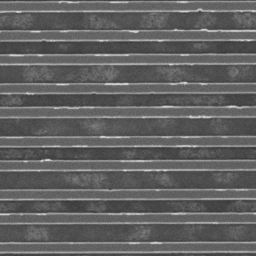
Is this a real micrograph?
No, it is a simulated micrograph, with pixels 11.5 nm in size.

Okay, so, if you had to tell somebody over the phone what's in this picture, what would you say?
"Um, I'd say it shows parallel lines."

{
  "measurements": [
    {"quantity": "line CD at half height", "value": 121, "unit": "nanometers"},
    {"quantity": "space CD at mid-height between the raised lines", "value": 212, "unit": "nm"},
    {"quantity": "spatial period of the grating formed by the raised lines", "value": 308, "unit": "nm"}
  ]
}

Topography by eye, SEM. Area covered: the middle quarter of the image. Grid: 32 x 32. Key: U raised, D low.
DDDDDDDDDDDDDDDDDDDDDDDDDDDDDDDD
DDDDDDDDDDDDDDDDDDDDDDDDDDDDDDDD
DDDDDDDDDDDDDDDDDDDDDDDDDDDDDDDD
DDDDDDDDDDDDDDDDDDDDDDDDDDDDDDDD
DDDDDDDDDDDDDDDDDDDDDDDDDDDDDDDD
UUUUUUUUUUUUUUUUUUUUUUUUUUUUUUUU
UUUUUUUUUUUUUUUUUUUUUUUUUUUUUUUU
DDDDDDDDDDDDDDDDDDDDDDDDDDDDDDDD
DDDDDDDDDDDDDDDDDDDDDDDDDDDDDDDD
DDDDDDDDDDDDDDDDDDDDDDDDDDDDDDDD
DDDDDDDDDDDDDDDDDDDDDDDDDDDDDDDD
UUUUUUUUUUUUUUUUUUUUUUUUUUUUUUUU
UUUUUUUUUUUUUUUUUUUUUUUUUUUUUUUU
DDDDDDDDDDDDDDDDDDDDDDDDDDDDDDDD
DDDDDDDDDDDDDDDDDDDDDDDDDDDDDDDD
DDDDDDDDDDDDDDDDDDDDDDDDDDDDDDDD
DDDDDDDDDDDDDDDDDDDDDDDDDDDDDDDD
DDDDDDDDDDDDDDDDDDDDDDDDDDDDDDDD
UUUUUUUUUUUUUUUUUUUUUUUUUUUUUUUU
UUUUUUUUUUUUUUUUUUUUUUUUUUUUUUUU
UUUUUUUUUUUUUUUUUUUUUUUUDDDUUUDU
DDDDDDDDDDDDDDDDDDDDDDDDDDDDDDDD
DDDDDDDDDDDDDDDDDDDDDDDDDDDDDDDD
DDDDDDDDDDDDDDDDDDDDDDDDDDDDDDDD
UUUUUUUUUUUUUUUUUUUUUUUUUUUUUUUU
UUUUUUUUUUUUUUUUUUUUUUUUUUUUUUUU
UUUUUUUUUDDDDDDUUDDDUUDUUUDDDDDD
DDDDDDDDDDDDDDDDDDDDDDDDDDDDDDDD
DDDDDDDDDDDDDDDDDDDDDDDDDDDDDDDD
DDDDDDDDDDDDDDDDDDDDDDDDDDDDDDDD
DDDDDDDDDDDDDDDDDDDDDDDDDDDDDDDD
DDDDDDDDDDDDDDDDDDDDUUDDDDDDDDDD